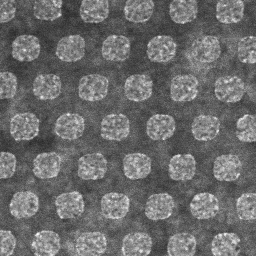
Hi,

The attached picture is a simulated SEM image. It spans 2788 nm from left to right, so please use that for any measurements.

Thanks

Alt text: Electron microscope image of a regular array of raised bodies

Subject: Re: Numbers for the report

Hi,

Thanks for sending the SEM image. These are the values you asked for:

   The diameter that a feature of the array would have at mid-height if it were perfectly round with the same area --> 300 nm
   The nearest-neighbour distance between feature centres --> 488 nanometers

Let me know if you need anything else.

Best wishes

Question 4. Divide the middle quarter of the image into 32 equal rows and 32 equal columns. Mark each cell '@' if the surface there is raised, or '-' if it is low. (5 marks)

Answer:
--------------------------------
--------------------------------
--------------------------------
-----@@@@@------@@@@@-------@@@@
----@@@@@@@----@@@@@@@-----@@@@@
----@@@@@@@----@@@@@@@-----@@@@@
----@@@@@@@----@@@@@@@-----@@@@@
----@@@@@@------@@@@@@-----@@@@@
----@@@@@@------@@@@@------@@@@@
--------------------------------
--------------------------------
--------------------------------
@@------------------------------
@@@@@-----@@@@@@------@@@@@-----
@@@@@-----@@@@@@-----@@@@@@-----
@@@@@-----@@@@@@-----@@@@@@@----
@@@@@----@@@@@@@-----@@@@@@@----
@@@@-----@@@@@@@-----@@@@@@-----
@@@-------@@@@@-------@@@@------
--------------------------------
--------------------------------
--------------------------------
-------@---------@@-------------
----@@@@@@-----@@@@@@------@@@@@
-----@@@@@-----@@@@@@@-----@@@@@
----@@@@@@-----@@@@@@-----@@@@@@
-----@@@@@@----@@@@@@-----@@@@@@
----@@@@@@-----@@@@@@-----@@@@@@
-----@@@@--------@@--------@@@@@
--------------------------------
--------------------------------
--------------------------------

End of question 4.